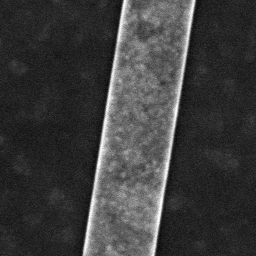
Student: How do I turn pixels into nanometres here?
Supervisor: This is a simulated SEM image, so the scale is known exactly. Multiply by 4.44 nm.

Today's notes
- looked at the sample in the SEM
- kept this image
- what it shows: one or a few lines or trenches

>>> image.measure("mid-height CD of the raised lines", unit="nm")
308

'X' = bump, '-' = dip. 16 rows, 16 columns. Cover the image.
--------XXXX----
--------XXXX----
-------XXXXX----
-------XXXXX----
-------XXXX-----
-------XXXX-----
-------XXXX-----
-------XXXX-----
------XXXXX-----
------XXXXX-----
------XXXX------
------XXXX------
------XXXX------
------XXXX------
-----XXXXX------
-----XXXXX------